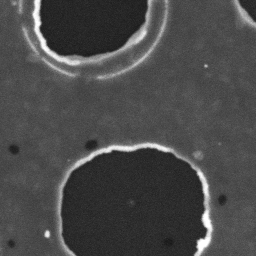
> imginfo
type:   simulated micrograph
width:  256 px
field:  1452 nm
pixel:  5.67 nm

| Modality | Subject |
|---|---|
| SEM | holes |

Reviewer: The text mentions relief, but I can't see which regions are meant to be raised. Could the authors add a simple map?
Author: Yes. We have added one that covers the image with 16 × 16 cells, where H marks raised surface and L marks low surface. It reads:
HHLLLLLLLHHHHHHL
HHHLLLLLLHHHHHHH
HHHLLLLLHHHHHHHH
HHHHLLLHHHHHHHHH
HHHHHHHHHHHHHHHH
HHHHHHHHHHHHHHHH
HHHHHHHHHHHHHHHH
HHHHHHHHHHHHHHHH
HHHHHHHHHHHHHHHH
HHHHHHHLLLHHHHHH
HHHHHLLLLLLLHHHH
HHHHLLLLLLLLLHHH
HHHHLLLLLLLLLHHH
HHHHLLLLLLLLLHHH
HHHHLLLLLLLLLHHH
HHHHLLLLLLLLHHHH